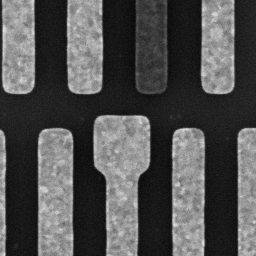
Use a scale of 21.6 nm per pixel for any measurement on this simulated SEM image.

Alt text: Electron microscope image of wiring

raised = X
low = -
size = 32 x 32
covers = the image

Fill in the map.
XXXX-----XXXX----XXXX----XXXX---
XXXX-----XXXX----XXXX----XXXX---
XXXX----XXXXX----XXXX----XXXX---
XXXX----XXXXX----XXXX----XXXX---
XXXX----XXXXX----XXXX----XXXX---
XXXX----XXXXX----XXXX----XXXX---
XXXX----XXXXX----XXXX----XXXX---
XXXX----XXXXX----XXXX----XXXX---
XXXX-----XXXX----XXXX----XXXX---
XXXX-----XXXX----XXXX----XXXX---
XXXX-----XXXX----XXXX----XXXX---
-XXX-----XXX------XX------XXX---
--------------------------------
--------------------------------
--------------------------------
------------XXXXXXX-------------
-----XXXX---XXXXXXX---XXX-----XX
X----XXXX---XXXXXXX---XXXX----XX
X----XXXX---XXXXXXX---XXXX----XX
X----XXXX---XXXXXXX---XXXX----XX
X----XXXX---XXXXXXX---XXXX----XX
X----XXXX----XXXXX----XXXX----XX
X----XXXX----XXXX-----XXXX----XX
X----XXXX----XXXX-----XXXX----XX
X----XXXX----XXXX-----XXXX----XX
X----XXXX----XXXX-----XXXX----XX
X----XXXX----XXXX-----XXX-----XX
X----XXXX----XXXX-----XXX-----XX
X----XXXX----XXXX-----XXXX----XX
X----XXXX----XXXX-----XXXX----XX
X----XXXX----XXXX-----XXXX----XX
X----XXXX----XXXX-----XXX-----XX